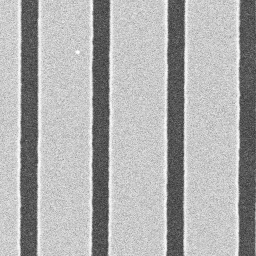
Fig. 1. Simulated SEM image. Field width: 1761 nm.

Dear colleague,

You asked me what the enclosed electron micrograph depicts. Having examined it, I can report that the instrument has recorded lines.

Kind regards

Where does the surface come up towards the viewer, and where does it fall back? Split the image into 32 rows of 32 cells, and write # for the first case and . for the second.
###..#######..#######..#######..
###..#######..#######..#######..
###..#######..#######..#######..
###..#######..#######..#######..
###..#######..#######..#######..
###..#######..#######..#######..
###..#######..#######..#######..
###..#######..#######..#######..
###..######...#######..#######..
###..#######..#######..#######..
###..#######..#######..#######..
###..#######..#######..#######..
###..######...#######..#######..
###..#######..#######..#######..
###..#######..#######..#######..
###..#######..#######..#######..
###..######...#######..#######..
##...#######..#######..#######..
##...#######..#######..#######..
##...#######..#######..#######..
##...######...#######..#######..
##...######...#######..#######..
##...######...#######..#######..
##...#######..#######..#######..
##...#######..#######..#######..
##...######...#######..#######..
##...#######..#######..#######..
##...######...#######..#######..
##...######...#######..#######..
##...######...#######..#######..
##...######...#######..#######..
##...######...#######..#######..